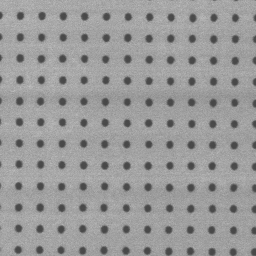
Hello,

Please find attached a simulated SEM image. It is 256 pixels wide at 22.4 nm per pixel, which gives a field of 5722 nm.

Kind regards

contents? a regular array of holes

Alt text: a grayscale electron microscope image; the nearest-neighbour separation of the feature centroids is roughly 466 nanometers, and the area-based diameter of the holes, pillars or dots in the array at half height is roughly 178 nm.